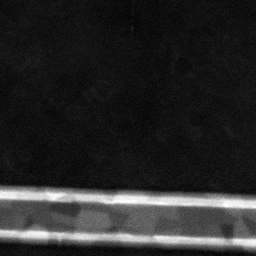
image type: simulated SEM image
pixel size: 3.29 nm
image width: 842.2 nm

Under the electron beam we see one or a few lines or trenches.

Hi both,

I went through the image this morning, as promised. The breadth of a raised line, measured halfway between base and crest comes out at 135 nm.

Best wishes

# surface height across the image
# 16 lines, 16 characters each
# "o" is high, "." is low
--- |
................
................
................
................
................
................
................
................
................
................
................
................
ooooooooooo.....
oooooooooooooooo
oooooooooooooooo
................